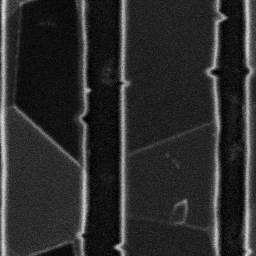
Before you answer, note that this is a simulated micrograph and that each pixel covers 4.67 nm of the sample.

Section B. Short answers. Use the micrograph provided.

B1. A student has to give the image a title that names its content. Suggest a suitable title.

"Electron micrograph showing one or a few lines or trenches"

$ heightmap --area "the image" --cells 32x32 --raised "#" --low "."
.#########......###########....#
.#########.....############....#
.#########.....#############...#
.#########.....############....#
.##########....############....#
.##########....############....#
.##########....############....#
.#########.....############....#
.#########.....############....#
.##########....############....#
.##########....############....#
.##########....############....#
###########....############....#
###########....############....#
##########.....############....#
##########.....############....#
###########....############....#
###########....############....#
##########.....############....#
###########....############....#
.##########....############....#
###########....############....#
###########....############....#
###########....############....#
##########.....############....#
##########.....############....#
##########.....############....#
##########.....############....#
##########.....############....#
##########.....############....#
##########.....############....#
##########.....############....#